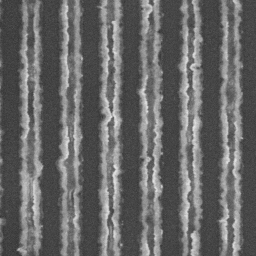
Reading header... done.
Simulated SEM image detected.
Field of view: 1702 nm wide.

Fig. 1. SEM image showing parallel lines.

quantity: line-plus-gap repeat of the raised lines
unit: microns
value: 0.266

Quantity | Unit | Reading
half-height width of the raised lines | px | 13.9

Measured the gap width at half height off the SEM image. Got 174 nanometres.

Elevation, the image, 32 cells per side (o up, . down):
...oo...oo...oo...oo...oo...oo..
...oo...oo...oo...oo...oo...oo..
...oo...oo...oo...oo...oo...oo..
...oo...oo...oo...oo...oo...oo..
...oo...oo...oo...oo...oo...oo..
...oo...oo...oo...oo...oo...oo..
...oo...oo...oo...oo...oo...oo..
...oo...oo...oo...o....oo...oo..
...oo...oo...oo...oo...oo...oo..
...oo...oo...oo...oo...oo...oo..
...oo...oo...oo...oo...oo...oo..
...oo...oo...oo...oo...oo...oo..
...oo...oo...oo...oo...oo...oo..
...oo...oo...oo...oo...oo...oo..
...oo...oo...oo...oo...oo...oo..
...oo...oo...oo...oo...oo...oo..
...oo...oo...oo...oo...oo...oo..
...oo...oo...oo...oo...oo...oo..
...oo...oo...oo...oo...oo...oo..
...oo...oo...oo...oo...oo...oo..
...oo...oo...oo...oo...oo...oo..
...oo...oo...oo...oo...oo...oo..
...oo...oo...oo...oo...oo...oo..
...oo...oo...oo...oo...oo...oo..
...oo...oo...oo...oo...oo...oo..
...oo...oo...oo...oo...oo...oo..
...oo...oo...oo...oo...oo...oo..
...oo...oo...oo...oo...oo...oo..
...oo...oo...oo...oo...oo...oo..
...oo...oo...oo...oo...oo...oo..
...oo...oo...oo...oo...oo...oo..
...oo...oo...oo...oo...o....oo..